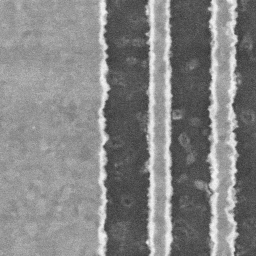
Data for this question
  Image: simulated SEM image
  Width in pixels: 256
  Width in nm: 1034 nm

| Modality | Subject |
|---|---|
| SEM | one or a few lines or trenches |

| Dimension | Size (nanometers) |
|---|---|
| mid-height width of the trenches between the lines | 190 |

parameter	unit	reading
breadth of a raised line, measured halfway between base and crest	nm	71.9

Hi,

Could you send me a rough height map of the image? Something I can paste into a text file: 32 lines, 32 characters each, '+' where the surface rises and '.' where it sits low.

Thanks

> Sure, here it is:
+++++++++++++......++......++...
+++++++++++++......++......++...
+++++++++++++......++......++...
+++++++++++++......++......++...
+++++++++++++......++......++...
+++++++++++++......++......++...
+++++++++++++......++......++...
+++++++++++++......++......++...
+++++++++++++......++......++...
+++++++++++++......++......++...
+++++++++++++......++......++...
+++++++++++++......++......++...
+++++++++++++......++......++...
+++++++++++++......++......++...
+++++++++++++......++......++...
+++++++++++++......++......++...
+++++++++++++......++......++...
+++++++++++++......++......++...
+++++++++++++......++......++...
+++++++++++++......++......++...
+++++++++++++......++......++...
+++++++++++++......++......++...
+++++++++++++......++......++...
+++++++++++++......++......++...
+++++++++++++......++......++...
+++++++++++++......++......++...
+++++++++++++......++......++...
+++++++++++++......++......++...
+++++++++++++......++......++...
+++++++++++++......++......++...
+++++++++++++......++......++...
+++++++++++++......++......++...